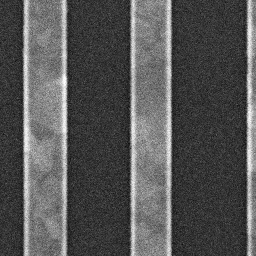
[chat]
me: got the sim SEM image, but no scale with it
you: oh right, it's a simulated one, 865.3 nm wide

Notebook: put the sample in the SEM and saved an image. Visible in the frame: one or a few lines or trenches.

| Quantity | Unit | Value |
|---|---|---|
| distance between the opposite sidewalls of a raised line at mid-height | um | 0.127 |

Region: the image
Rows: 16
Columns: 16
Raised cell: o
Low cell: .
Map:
..oo....ooo.....
..oo....ooo.....
..oo....ooo.....
..oo....ooo.....
..oo....ooo.....
..oo....ooo.....
..oo....ooo.....
..oo....ooo.....
..oo....ooo.....
..oo....ooo.....
..oo....ooo.....
..oo....ooo.....
..oo....ooo.....
..oo....ooo.....
..oo....ooo.....
..oo....ooo.....